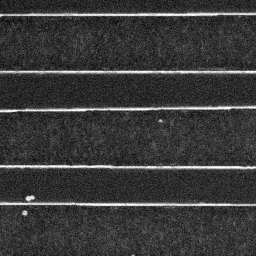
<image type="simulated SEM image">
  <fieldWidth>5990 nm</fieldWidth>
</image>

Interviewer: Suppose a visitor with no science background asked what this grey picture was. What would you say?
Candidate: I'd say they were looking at lines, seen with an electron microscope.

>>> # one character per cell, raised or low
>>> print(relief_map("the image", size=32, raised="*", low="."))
********************************
********************************
................................
................................
................................
................................
................................
................................
................................
********************************
********************************
********************************
********************************
***************************.....
................................
................................
................................
................................
................................
................................
................................
********************************
********************************
********************************
********************************
...........*********************
................................
................................
................................
................................
................................
................................